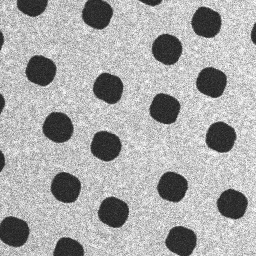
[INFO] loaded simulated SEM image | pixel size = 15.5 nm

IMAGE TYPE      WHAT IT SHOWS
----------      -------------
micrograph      a regular array of holes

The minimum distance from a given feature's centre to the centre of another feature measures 835 nm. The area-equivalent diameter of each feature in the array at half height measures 0.479 um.